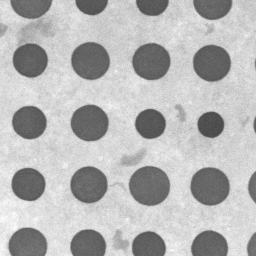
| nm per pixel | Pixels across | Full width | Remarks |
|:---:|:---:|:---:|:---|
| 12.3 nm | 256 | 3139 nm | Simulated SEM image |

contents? a regular array of holes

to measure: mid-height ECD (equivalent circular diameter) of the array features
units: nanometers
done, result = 455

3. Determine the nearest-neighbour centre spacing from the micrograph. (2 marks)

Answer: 60.5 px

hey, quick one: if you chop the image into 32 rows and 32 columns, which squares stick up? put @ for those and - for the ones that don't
@-----@@@@---@@@@----@@@-----@@@
@@----@@@@---@@@@@--@@@@@----@@@
@@@@@@@@@@@@@@@@@@@@@@@@@@@@@@@@
@@@@@@@@@@@@@@@@@@@@@@@@@@@@@@@@
@@@@@@@@@@@@@@@@@@@@@@@@@@@@@@@@
@@@-@@@@@@--@@@@@@--@@@@@@@@@@@@
@@----@@@----@@@@----@@@@---@@@@
@@----@@@-----@@@----@@@-----@@@
@@----@@@-----@@@----@@@-----@@@
@@@--@@@@@---@@@@---@@@@@---@@@@
@@@@@@@@@@@@@@@@@@@@@@@@@@@@@@@@
@@@@@@@@@@@@@@@@@@@@@@@@@@@@@@@@
@@@@@@@@@@@@@@@@@@@@@@@@@@@@@@@@
@@@--@@@@@--@@@@@@@@@@@@@@@@@@@@
@@----@@@----@@@@---@@@@@---@@@@
@@----@@@-----@@@----@@@@---@@@@
@@---@@@@----@@@@---@@@@@---@@@@
@@@@@@@@@@--@@@@@@@@@@@@@@@@@@@@
@@@@@@@@@@@@@@@@@@@@@@@@@@@@@@@@
@@@@@@@@@@@@@@@@@@@@@@@@@@@@@@@@
@@@@@@@@@@@@@@@@@@@@@@@@@@@@@@@@
@@---@@@@----@@@@---@@@@@---@@@@
@@----@@@----@@@-----@@@----@@@-
@@----@@@----@@@-----@@@-----@@-
@@---@@@@----@@@@----@@@----@@@-
@@@@@@@@@@@@@@@@@@--@@@@@--@@@@@
@@@@@@@@@@@@@@@@@@@@@@@@@@@@@@@@
@@@@@@@@@@@@@@@@@@@@@@@@@@@@@@@@
@@@-@@@@@@@@@@@@@@@@@@@@@@@@@@@@
@----@@@@----@@@@---@@@@@---@@@@
@-----@@@----@@@@----@@@----@@@-
@-----@@@----@@@@----@@@----@@@-